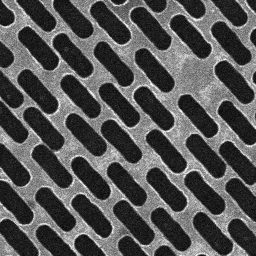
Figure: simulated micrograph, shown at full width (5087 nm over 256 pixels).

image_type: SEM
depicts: a regular array of holes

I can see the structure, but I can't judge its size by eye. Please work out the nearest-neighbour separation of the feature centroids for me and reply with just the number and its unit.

746 nm